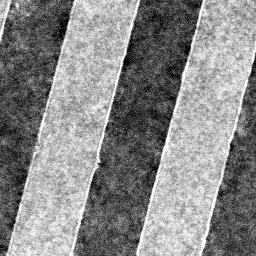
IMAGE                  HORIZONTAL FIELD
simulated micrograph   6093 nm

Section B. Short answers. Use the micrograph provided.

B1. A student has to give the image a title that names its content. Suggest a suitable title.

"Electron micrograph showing one or a few lines or trenches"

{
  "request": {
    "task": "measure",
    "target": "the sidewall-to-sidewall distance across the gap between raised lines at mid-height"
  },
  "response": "1490 nm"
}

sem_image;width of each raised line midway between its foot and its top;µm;1.47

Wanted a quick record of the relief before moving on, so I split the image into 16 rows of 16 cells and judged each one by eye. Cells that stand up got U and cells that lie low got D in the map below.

UDDDDUUUUDDDDUUU
DDDDUUUUDDDDUUUU
DDDDUUUUDDDDUUUU
DDDDUUUUDDDDUUUU
DDDDUUUDDDDDUUUU
DDDUUUUDDDDDDUUD
DDDUUUUDDDDUUUUD
DDDUUUUDDDDUUUUD
DDUUUUDDDDUUUUDD
DDUUUUDDDDUUUUDD
DDUUUUDDDDUUUUDD
DDUUUUDDDDUUUUDD
DUUUUDDDDUUUUDDD
DUUUUDDDDUUUUDDD
DUUUUDDDDUUUUDDD
DUUUDDDDDUUUUDDD